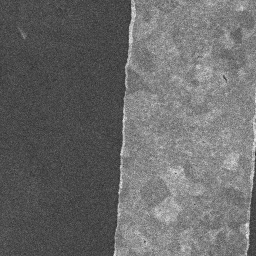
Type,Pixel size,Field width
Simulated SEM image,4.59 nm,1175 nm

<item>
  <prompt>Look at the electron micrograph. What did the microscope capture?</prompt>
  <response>one or a few lines or trenches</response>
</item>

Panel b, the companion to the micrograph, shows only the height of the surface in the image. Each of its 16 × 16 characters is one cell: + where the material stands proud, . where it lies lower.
........++++++++
........++++++++
........++++++++
........++++++++
........++++++++
........++++++++
........++++++++
........++++++++
........++++++++
........++++++++
........++++++++
.......+++++++++
.......+++++++++
.......+++++++++
.......+++++++++
.......+++++++++